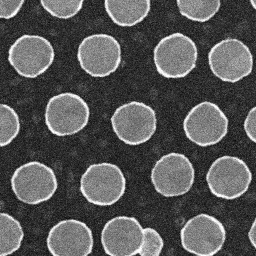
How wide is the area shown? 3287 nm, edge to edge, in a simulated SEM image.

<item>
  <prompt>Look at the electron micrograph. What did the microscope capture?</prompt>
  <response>a regular array of raised bodies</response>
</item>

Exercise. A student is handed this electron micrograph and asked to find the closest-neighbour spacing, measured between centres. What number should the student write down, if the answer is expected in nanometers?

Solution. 830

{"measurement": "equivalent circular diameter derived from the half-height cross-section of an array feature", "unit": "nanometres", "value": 534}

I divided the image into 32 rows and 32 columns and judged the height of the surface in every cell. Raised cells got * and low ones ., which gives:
***..*****...******...*****.....
**....****....****.....****.....
..............***........*......
................................
............*.........*.........
..****....*****.....****...***..
.******...*****....******.*****.
.*****....*****....*****..*****.
..****.....***......****..*****.
.....................*.....****.
................................
................................
......****......................
*.....*****....****.....***.....
**....*****...*****.....****...*
**....*****...*****....*****...*
**.....**......****....*****...*
*..............***......***.....
................................
.....................**.........
....*...............****...***..
..****.....****....*****..*****.
..*****...*****....*****..*****.
..*****...*****.....****..*****.
..****.....****.............*...
................................
................................
**............***.......***.....
***....****..*****.....*****....
***...*****..*******...*****...*
**....*****..*******...*****....
**....*****...***.**....***.....